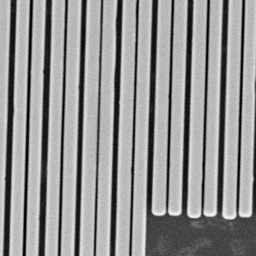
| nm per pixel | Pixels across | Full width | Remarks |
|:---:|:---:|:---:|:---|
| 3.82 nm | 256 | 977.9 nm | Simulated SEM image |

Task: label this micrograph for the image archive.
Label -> parallel lines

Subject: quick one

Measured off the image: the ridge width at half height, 53 nm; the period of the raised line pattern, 67.2 nm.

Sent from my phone